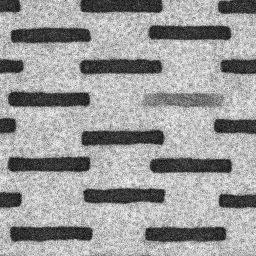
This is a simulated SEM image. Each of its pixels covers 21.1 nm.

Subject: a regular array of holes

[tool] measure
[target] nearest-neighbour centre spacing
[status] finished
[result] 65.7 px